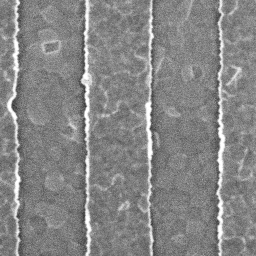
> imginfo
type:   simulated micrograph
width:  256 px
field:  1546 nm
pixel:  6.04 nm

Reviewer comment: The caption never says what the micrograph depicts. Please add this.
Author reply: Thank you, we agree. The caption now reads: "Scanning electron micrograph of one or a few lines or trenches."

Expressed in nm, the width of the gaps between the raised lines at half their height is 417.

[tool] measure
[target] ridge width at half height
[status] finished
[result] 394 nanometres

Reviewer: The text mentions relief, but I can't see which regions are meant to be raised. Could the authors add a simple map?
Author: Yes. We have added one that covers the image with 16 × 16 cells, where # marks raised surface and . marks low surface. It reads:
#....####.....##
#....####.....##
#....####.....##
#....####.....##
#....####.....##
#....####.....##
#....####.....##
#....####.....##
#....####.....##
#....####.....##
#....####.....##
#....####.....##
#....####.....##
#....####.....##
#....####.....##
#....####.....##